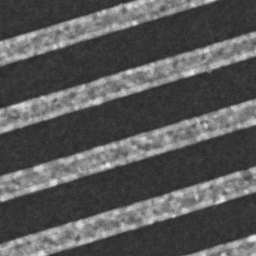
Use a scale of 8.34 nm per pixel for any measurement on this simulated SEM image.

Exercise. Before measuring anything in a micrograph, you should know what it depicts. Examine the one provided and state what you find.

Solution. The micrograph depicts one or a few lines or trenches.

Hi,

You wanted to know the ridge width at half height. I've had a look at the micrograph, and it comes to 160 nanometres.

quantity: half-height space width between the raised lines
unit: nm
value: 383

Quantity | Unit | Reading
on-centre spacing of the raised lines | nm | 541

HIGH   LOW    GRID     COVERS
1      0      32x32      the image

00000000000000000111111110000000
00000000000001111111100000000000
00000000001111111100000000000000
00000001111111100000000000000000
00011111111100000000000000000001
11111111000000000000000000001111
11111000000000000000000011111111
11000000000000000000011111111000
00000000000000000011111111000000
00000000000000011111111000000000
00000000000011111110000000000000
00000000111111110000000000000000
00000111111110000000000000000000
01111111110000000000000000000111
11111100000000000000000000111111
11100000000000000000000111111110
00000000000000000001111111110000
00000000000000001111111100000000
00000000000001111111100000000000
00000000001111111100000000000000
00000011111111000000000000000000
00011111111000000000000000000001
11111111000000000000000000001111
11111000000000000000000011111111
11000000000000000000011111111000
00000000000000000011111111000000
00000000000000111111111000000000
00000000000111111110000000000000
00000000111111110000000000000000
00001111111110000000000000000000
01111111110000000000000000000111
11111100000000000000000000111111